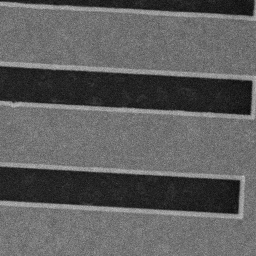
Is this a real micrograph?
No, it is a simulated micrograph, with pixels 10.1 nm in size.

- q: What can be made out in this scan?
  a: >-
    one or a few lines or trenches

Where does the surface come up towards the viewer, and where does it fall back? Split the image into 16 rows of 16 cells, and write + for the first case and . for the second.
+++.............
++++++++++++++++
++++++++++++++++
++++++++++++++++
.........+++++++
................
................
++++++++++++++++
++++++++++++++++
++++++++++++++++
....++++++++++++
...............+
...............+
++++++++++++++.+
++++++++++++++++
++++++++++++++++